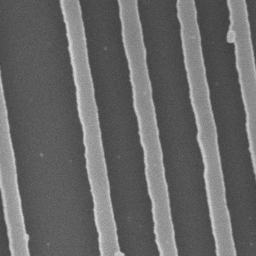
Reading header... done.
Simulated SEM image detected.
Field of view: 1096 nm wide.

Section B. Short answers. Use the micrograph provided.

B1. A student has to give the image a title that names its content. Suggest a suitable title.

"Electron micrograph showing lines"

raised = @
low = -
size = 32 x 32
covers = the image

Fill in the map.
--------@@-----@@-----@@-----@@-
--------@@-----@@-----@@@----@@-
--------@@-----@@-----@@@----@@-
--------@@-----@@@-----@@----@@-
--------@@@----@@@-----@@---@@@-
---------@@----@@@-----@@----@@-
---------@@-----@@-----@@----@@@
---------@@-----@@-----@@-----@@
---------@@-----@@-----@@@----@@
---------@@-----@@@----@@@----@@
---------@@@----@@@-----@@----@@
----------@@-----@@-----@@----@@
@---------@@-----@@-----@@----@@
@---------@@-----@@-----@@-----@
@---------@@-----@@-----@@@----@
@---------@@-----@@@-----@@----@
@---------@@@----@@@-----@@----@
@---------@@@-----@@-----@@----@
@@---------@@-----@@-----@@----@
@@---------@@-----@@-----@@-----
@@---------@@-----@@------@@----
@@---------@@-----@@@-----@@----
@@---------@@@----@@@-----@@----
@@---------@@@-----@@-----@@----
@@----------@@-----@@-----@@----
@@@---------@@-----@@-----@@----
@@@---------@@-----@@-----@@@---
-@@---------@@-----@@-----@@@---
-@@---------@@@----@@@----@@@---
-@@@--------@@@----@@@-----@@---
-@@---------@@@-----@@-----@@---
-@@@---------@@-----@@-----@@---